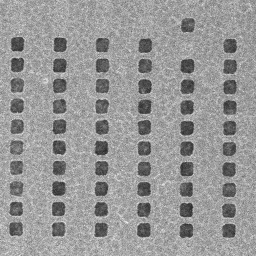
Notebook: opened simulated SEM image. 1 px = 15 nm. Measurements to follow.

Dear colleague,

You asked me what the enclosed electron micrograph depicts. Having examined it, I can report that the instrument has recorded a regular array of holes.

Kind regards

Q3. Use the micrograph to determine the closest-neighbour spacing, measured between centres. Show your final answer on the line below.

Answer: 20.5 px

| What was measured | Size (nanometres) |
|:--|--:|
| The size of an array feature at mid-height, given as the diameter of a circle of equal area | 232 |